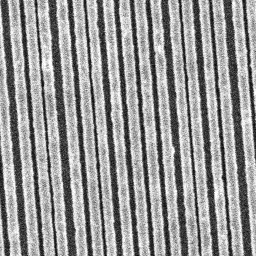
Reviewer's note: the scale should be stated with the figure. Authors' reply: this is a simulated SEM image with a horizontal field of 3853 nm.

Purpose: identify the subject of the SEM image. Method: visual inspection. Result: parallel lines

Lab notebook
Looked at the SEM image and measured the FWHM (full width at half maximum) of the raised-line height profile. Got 146 nm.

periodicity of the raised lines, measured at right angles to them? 240 nanometres